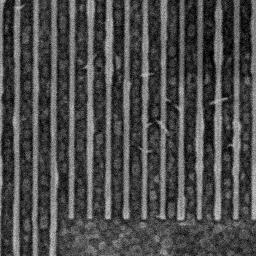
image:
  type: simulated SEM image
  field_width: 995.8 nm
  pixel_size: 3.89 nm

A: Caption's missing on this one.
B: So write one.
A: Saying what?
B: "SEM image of parallel lines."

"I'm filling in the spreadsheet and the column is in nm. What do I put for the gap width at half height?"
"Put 50.6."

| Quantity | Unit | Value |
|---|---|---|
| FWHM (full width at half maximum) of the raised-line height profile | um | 0.0214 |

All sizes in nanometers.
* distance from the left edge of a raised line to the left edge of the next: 71.2